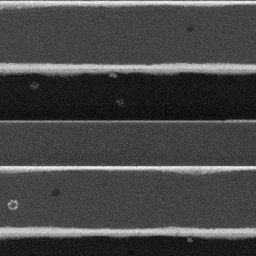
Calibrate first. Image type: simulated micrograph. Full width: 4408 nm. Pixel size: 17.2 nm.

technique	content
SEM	lines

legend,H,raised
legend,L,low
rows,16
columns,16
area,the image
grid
HHHHHHHHHHHHHHHH
HHHHHHHHHHHHHHHH
HHHHHHHHHHHHHHHH
HHHHHHHHHHHHHHHH
LLLLLLLLLLLLLLLL
LLLLLLLLLLLLLLLL
LLLLLLLLLLLLLLLL
LLLLLLLLLLLLLLLL
HHHHHHHHHHHHHHHH
HHHHHHHHHHHHHHHH
HHHHHHHHHHHHHHHH
HHHHHHHHHHHHHHHH
HHHHHHHHHHHHHHHH
HHHHHHHHHHHHHHHH
HHHHHHHHHHHHHHHH
LLLLLLLLLLLLLLLL